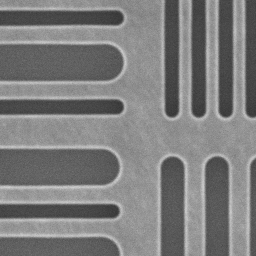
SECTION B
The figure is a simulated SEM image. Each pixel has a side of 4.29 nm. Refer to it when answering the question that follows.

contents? groups of lines, slits or small figures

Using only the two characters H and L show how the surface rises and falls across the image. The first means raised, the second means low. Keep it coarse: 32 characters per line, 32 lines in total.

HHHHHHHHHHHHHHHHHHHHHLHHLLHLLHHL
LLLLLLLLLLLLLLLHHHHHHLHHLLHLLHHL
LLLLLLLLLLLLLLLHHHHHLLHHLLHLLHHL
HHHHHHHHHHHHHHHHHHHHLLHHLLHLLHHL
HHHHHHHHHHHHHHHHHHHHLLHHLLHLLHHL
LLLLLLLLLLLLLHHHHHHHLLHHLLHLLHHL
LLLLLLLLLLLLLLLHHHHHLLHHLLHLLHHL
LLLLLLLLLLLLLLLHHHHHLLHHLLHLLHHL
LLLLLLLLLLLLLLLHHHHHHLHHLLHLLHHL
LLLLLLLLLLLLLLLHHHHHHLHHLLHLLHHL
HHHHHHHHHHHHHHHHHHHHHLHHLLHLLHHL
HHHHHHHHHHHHHHHHHHHHHLHHLLHLLHHL
LLLLLLLLLLLLLLLHHHHHHLHHLLHLLHHL
LLLLLLLLLLLLLLLHHHHHHLHHLLHLLHHL
HHHHHHHHHHHHHHHHHHHHHLHHLHHHLHHL
HHHHHHHHHHHHHHHHHHHHHHHHHHHHHHHH
HHHHHHHHHHHHHHHHHHHHHHHHHHHHHHHH
HHHHHHHHHHHHHHHHHHHHHHHHHHHHHHHH
LLLLLLLLLLLLLHHHHHHHHHHHHHHHHHHH
LLLLLLLLLLLLLLLHHHHHHLHHHHHHHHHH
LLLLLLLLLLLLLLLHHHHHLLLHHHLLLHHL
LLLLLLLLLLLLLLLHHHHHLLLHHLLLLHHL
LLLLLLLLLLLLLLHHHHHHLLLHHLLLLHHL
HHHHHHHHHHHHHHHHHHHHLLLHHLLLLHHL
HHHHHHHHHHHHHHHHHHHHLLLHHLLLLHHL
LLLLLLLLLLLLLLHHHHHHLLLHHHLLLHHL
LLLLLLLLLLLLLLLHHHHHLLLHHHLLLHHL
HHHHHHHHHHHHHHHHHHHHLLLHHHLLLHHL
HHHHHHHHHHHHHHHHHHHHLLLHHHLLLHHL
HHHHHHHHHHHHHHHHHHHHLLLHHHLLLHHL
LLLLLLLLLLLLLLLHHHHHLLLHHHLLLHHL
LLLLLLLLLLLLLLLHHHHHLLLHHHLLLHHL